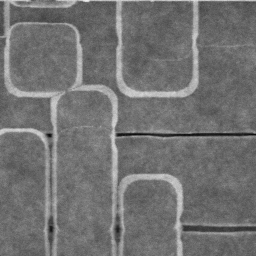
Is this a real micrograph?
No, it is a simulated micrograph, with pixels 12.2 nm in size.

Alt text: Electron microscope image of wiring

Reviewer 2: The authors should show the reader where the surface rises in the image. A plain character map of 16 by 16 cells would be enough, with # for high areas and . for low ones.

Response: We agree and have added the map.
.......#####....
.###...#####....
.####..#####....
#####..#####....
#####..#####....
.#####..####....
...####.........
...####.........
#######.........
#######.........
#######.........
#######.###.....
###########.....
###########.....
#######.###.....
###########.....